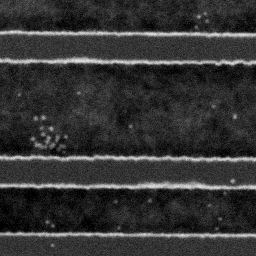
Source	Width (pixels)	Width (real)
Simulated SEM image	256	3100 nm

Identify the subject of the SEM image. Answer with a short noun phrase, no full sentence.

lines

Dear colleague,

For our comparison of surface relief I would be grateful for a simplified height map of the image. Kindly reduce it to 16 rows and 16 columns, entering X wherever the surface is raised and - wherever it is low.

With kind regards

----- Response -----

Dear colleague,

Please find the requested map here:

----------------
----------------
XXXXXXXXXXXXXXXX
XXXXXXXXXXXXXXXX
----------------
----------------
----------------
----------------
----------------
----------------
XXXXXXXXXXXXXXXX
XXXXXXXXXXXXXXXX
----------------
----------------
----------------
XXXXXXXXXXXXXXXX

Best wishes